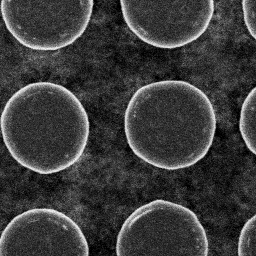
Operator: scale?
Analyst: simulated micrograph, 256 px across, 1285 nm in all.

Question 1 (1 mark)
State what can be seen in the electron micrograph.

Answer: raised bodies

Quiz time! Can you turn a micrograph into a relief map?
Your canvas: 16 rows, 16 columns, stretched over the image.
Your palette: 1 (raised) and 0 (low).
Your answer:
1111110011111001
1111100011111001
0111100001110000
0000000000000000
0000000000000000
0011000001110000
0111100011111001
1111100011111001
1111100011111001
0111100001111000
0011000000100000
0000000000000000
0000000000000000
0111000011110000
1111100011111001
1111100111111001